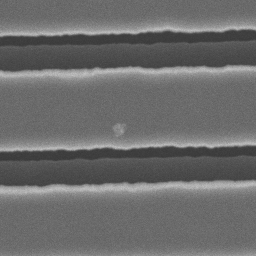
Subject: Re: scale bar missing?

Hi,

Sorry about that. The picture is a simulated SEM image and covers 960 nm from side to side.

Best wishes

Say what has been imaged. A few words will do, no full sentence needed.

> lines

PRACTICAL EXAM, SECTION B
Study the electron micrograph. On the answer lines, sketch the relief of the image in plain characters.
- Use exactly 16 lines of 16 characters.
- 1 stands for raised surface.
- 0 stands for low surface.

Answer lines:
1111111111111111
1111111111111111
0000000000000000
0000000000000000
1111111111111111
1111111111111111
1111111111111111
1111111111111111
1111111111111111
0000000000000000
0000000000000000
0000000111111111
1111111111111111
1111111111111111
1111111111111111
1111111111111111